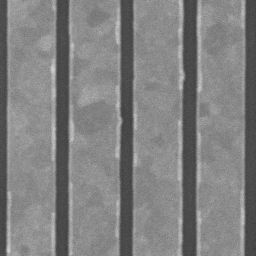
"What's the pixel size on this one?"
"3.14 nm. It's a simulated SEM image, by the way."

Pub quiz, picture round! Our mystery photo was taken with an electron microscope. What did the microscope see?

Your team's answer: one or a few lines or trenches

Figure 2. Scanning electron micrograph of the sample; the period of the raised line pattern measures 0.198 micrometres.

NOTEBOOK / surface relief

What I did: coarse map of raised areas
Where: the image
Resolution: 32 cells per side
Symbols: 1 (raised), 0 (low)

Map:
01111110011111100111111001111100
01111110011111100111111001111100
01111110011111100111111001111100
01111110011111100111111001111100
01111110011111100111111001111100
01111110011111100111111001111100
01111110011111100111111001111100
01111110011111100111111001111110
01111110011111100111111001111100
01111110011111100111111001111100
01111110011111100111111001111100
01111110011111100111111001111100
01111110011111100111111001111100
01111110011111100111111001111100
01111110011111100111111001111100
01111110011111100111111001111110
01111110011111100111111001111100
01111110011111100111111001111100
01111110011111100111111001111100
01111110011111100111111001111100
01111110011111100111111001111100
01111110011111100111111001111100
01111110011111100111111001111100
01111110011111100111111001111100
01111110011111100111111001111100
01111110011111100111111001111100
01111110011111100111111001111110
01111110011111100111111001111110
01111110011111100111111001111100
01111110011111100111111001111100
01111110011111100111111001111100
01111110011111100111111001111100